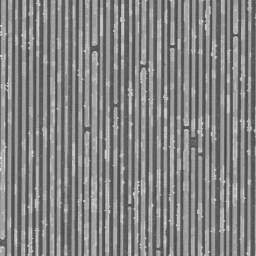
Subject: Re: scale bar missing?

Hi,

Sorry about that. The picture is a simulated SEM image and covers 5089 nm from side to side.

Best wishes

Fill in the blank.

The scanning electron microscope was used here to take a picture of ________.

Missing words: parallel lines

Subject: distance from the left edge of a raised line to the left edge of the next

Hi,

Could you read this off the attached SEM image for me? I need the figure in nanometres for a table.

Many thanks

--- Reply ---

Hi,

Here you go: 140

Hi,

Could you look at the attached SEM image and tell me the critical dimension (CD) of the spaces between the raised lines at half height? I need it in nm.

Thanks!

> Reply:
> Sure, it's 69.6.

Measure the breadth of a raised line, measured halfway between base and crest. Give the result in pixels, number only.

3.5